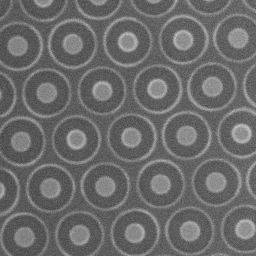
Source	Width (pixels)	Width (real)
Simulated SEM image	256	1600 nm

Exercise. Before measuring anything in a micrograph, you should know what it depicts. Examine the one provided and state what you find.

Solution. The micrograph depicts an array of small figures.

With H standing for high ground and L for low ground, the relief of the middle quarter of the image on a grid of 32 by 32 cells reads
LLLLHHHHHHHHHHHHHHHHHHHLHHHHHHHH
HHHHHHHLLLLLHHHHHHHHLLLLLLLHHHHH
HHHHHHLLLLLLLHHHHHHLLLLLLLLLHHHH
HHHHHLLLLLLLLLHHHHLLLLLLLLLLHHHH
LHHHLLLLLLLLLLLHHHLLLLHHHLLLLHHL
LHHHLLLLHHHLLLLHHHLLLHHHHHLLLHHL
LHHHLLLHHHHHLLLHHHLLLHHHHHLLLHHL
LLHHLLLHHHHHLLLHHHLLLHHHHLLLLHHL
LHHHLLLLHHHLLLLHHHLLLLLLLLLLLHHH
LHHHLLLLLLLLLLLHHHHLLLLLLLLLHHHH
LHHHHLLLLLLLLLHHHHHHLLLLLLLHHHHH
HHHHHHLLLLLLLHHHHHHHHLLLLLHHHHHH
HHHHHHHHHHHHHHHHHHHHHHHHHHHHHLLL
HLLLLHHHHHHHHHLLLLLLHHHHHHHLLLLL
LLLLLLLHHHHHHLLLLLLLLHHHHHLLLLLL
LLLLLLLLHHHHLLLLLLLLLLHHHLLLLLLL
LLLLLLLLHHHLLLLLHHLLLLHHHLLLLHHH
LHHHHLLLLHHLLLLHHHHLLLLHHLLLHHHH
LHHHHLLLLHHLLLLHHHHLLLLHHLLLHHHH
LHHHHLLLLHHLLLLHHHHLLLLHHLLLLHHH
LLHHHLLLLHHHLLLLHHLLLLHHHLLLLLLL
LLLLLLLLHHHHLLLLLLLLLLHHHHLLLLLL
LLLLLLLLHHHHHLLLLLLLLHHHHHHLLLLL
LLLLLLLHHHHHHHLLLLLLHHHHHHHHHLLL
HHLLLHHHHHHHHHHHHHHHHHHLLLHHHHHH
HHHHHHHHLLLLLHHHHHHHHLLLLLLLHHHH
HHHHHHLLLLLLLLHHHHHHLLLLLLLLLHHH
LHHHHLLLLLLLLLLHHHHLLLLLLLLLLHHH
LLHHHLLLLHHLLLLLHHHLLLHHHHLLLLHH
LLHHHLLLHHHHLLLLHHHLLLHHHHLLLLHH
LLHHHLLLHHHHHLLLHHLLLLHHHHLLLLHH
LLHHHLLLHHHHHLLLHHHLLLHHHHLLLLHH